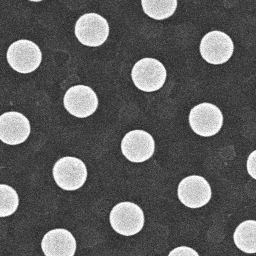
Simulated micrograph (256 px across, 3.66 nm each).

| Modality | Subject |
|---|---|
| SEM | a regular array of raised bodies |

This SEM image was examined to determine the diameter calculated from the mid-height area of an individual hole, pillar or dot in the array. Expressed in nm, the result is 123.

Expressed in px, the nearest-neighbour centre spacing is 72.3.